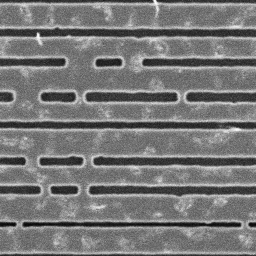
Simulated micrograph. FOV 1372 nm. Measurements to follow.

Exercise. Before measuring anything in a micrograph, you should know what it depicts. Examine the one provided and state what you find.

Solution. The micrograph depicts parallel lines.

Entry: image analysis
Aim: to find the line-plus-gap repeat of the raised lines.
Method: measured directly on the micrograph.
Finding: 172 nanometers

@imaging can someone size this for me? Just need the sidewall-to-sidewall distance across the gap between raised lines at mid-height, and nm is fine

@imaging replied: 45.6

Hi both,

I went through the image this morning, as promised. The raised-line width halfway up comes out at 25.6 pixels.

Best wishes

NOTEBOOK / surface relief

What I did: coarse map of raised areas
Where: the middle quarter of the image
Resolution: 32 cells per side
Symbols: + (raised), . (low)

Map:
++++++++......++++++............
++++++++++++++++++++++++++++++++
++++++++++++++++++++++++++++++++
++++++++++++++++++++++++++++++++
++++++++++++++++++++++++++++++++
++++++++++++++++++++++++++++++++
++++++++++++++++++++++++++++++++
...++.......................+++.
...++........................+..
..++++......................+++.
++++++++++++++++++++++++++++++++
++++++++++++++++++++++++++++++++
++++++++++++++++++++++++++++++++
++++++++++++++++++++++++++++++++
................................
................................
+.++++++++++++++++++++++++++++++
++++++++++++++++++++++++++++++++
++++++++++++++++++++++++++++++++
++++++++++++++++++++++++++++++++
++++++++++++++++++++++++++++++++
++++++++++++++++++++++++++++++++
++++++++++++++++++++++++++++++++
.....+++........................
.....++.........................
....++++...................+++..
++++++++++++++++++++++++++++++++
++++++++++++++++++++++++++++++++
++++++++++++++++++++++++++++++++
++++++++++++++++++++++++++++++++
...++++..............++.........
....++..........................